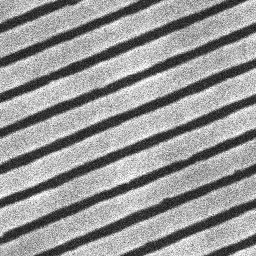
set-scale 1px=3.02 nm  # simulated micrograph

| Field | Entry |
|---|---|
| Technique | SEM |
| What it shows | parallel lines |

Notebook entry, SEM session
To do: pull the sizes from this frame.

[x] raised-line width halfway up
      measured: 66.7 nm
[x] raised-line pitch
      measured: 0.0983 micrometres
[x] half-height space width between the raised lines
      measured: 31.8 nm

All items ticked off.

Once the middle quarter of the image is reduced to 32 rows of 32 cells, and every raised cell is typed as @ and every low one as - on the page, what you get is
-------@@@@@@@@@@@@@@@-------@@@
-----@@@@@@@@@@@@@@@------@@@@@@
--@@@@@@@@@@@@@@@------@@@@@@@@@
@@@@@@@@@@@@@@-------@@@@@@@@@@@
@@@@@@@@@@@@-------@@@@@@@@@@@@@
@@@@@@@@@@-------@@@@@@@@@@@@@@-
@@@@@@@-------@@@@@@@@@@@@@@----
@@@@@-------@@@@@@@@@@@@@@------
@@-------@@@@@@@@@@@@@@-------@@
-------@@@@@@@@@@@@@@-------@@@@
----@@@@@@@@@@@@@@@-------@@@@@@
--@@@@@@@@@@@@@@-------@@@@@@@@@
@@@@@@@@@@@@@-------@@@@@@@@@@@@
@@@@@@@@@@@-------@@@@@@@@@@@@@@
@@@@@@@@-------@@@@@@@@@@@@@@@@-
@@@@@@--------@@@@@@@@@@@@@@----
@@@@-------@@@@@@@@@@@@@@@------
@@------@@@@@@@@@@@@@@@-------@@
------@@@@@@@@@@@@@@@-------@@@@
----@@@@@@@@@@@@@@-------@@@@@@@
--@@@@@@@@@@@@@@-------@@@@@@@@@
@@@@@@@@@@@@@-------@@@@@@@@@@@@
@@@@@@@@@@@-------@@@@@@@@@@@@@@
@@@@@@@@@------@@@@@@@@@@@@@@@@-
@@@@@@-------@@@@@@@@@@@@@@@----
@@@--------@@@@@@@@@@@@@@------@
@-------@@@@@@@@@@@@@@@------@@@
------@@@@@@@@@@@@@@-------@@@@@
---@@@@@@@@@@@@@@@------@@@@@@@@
-@@@@@@@@@@@@@@@------@@@@@@@@@@
@@@@@@@@@@@@@-------@@@@@@@@@@@@
@@@@@@@@@@-------@@@@@@@@@@@@@@@